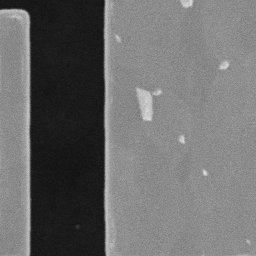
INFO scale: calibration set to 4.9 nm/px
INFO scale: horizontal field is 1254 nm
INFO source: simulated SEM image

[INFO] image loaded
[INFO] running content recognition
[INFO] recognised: wiring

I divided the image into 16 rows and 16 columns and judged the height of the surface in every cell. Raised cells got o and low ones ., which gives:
.......ooooooooo
oo.....ooooooooo
oo.....ooooooooo
oo.....ooooooooo
oo.....ooooooooo
oo.....ooooooooo
oo.....ooooooooo
oo.....ooooooooo
oo.....ooooooooo
oo.....ooooooooo
oo.....ooooooooo
oo.....ooooooooo
oo.....ooooooooo
oo.....ooooooooo
oo.....ooooooooo
oo.....ooooooooo